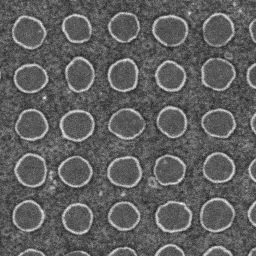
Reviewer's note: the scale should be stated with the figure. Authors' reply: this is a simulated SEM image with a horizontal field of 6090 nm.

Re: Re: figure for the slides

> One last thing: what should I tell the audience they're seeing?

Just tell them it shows a regular array of raised bodies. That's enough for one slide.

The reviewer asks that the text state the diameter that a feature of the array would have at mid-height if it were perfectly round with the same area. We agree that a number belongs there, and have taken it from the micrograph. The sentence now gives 716 nm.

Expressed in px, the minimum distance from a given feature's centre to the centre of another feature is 44.7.